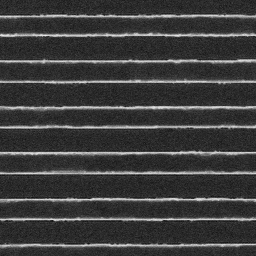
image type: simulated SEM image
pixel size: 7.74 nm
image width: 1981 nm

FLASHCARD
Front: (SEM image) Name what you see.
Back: lines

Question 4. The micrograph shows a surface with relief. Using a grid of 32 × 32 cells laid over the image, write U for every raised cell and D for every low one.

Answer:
DDDDDDDDDDDDDDDDDDDDDDDDDDDDDDDD
DDDDDDDDDDDDDDDDDDDDDDDDDDDDDDDD
UUUUUUUUUUUUUUUUUUUUUUUUUUUUUUUU
UUUUUUUUUUUUUUUUUUUUUUUUUUUUUUUU
DDDDDDDDDDDDDDDDDDDDDDDDDDDDDDDD
DDDDDDDDDDDDDDDDDDDDDDDDDDDDDDDD
DDDDDDDDDDDDDDDDDDDDDDDDDDDDDDDD
DDDDDDDDDDDDDDDDDDDDDDDDDDDDDDDD
UUUUUUUUUUUUUUUUUUUUUUUUUUUUUUUU
UUUUUUUUUUUUUUUUUUUUUUUUUUUUUUUU
DDDDDDDDDDDDDDDDDDDDDDDDDDDDDDDD
DDDDDDDDDDDDDDDDDDDDDDDDDDDDDDDD
DDDDDDDDDDDDDDDDDDDDDDDDDDDDDDDD
UUUUDUUUUUUUUUUUUUUUUUUUUUUUUUUU
UUUUUUUUUUUUUUUUUUUUUUUUUUUUUUUU
UUUUUUUUUUUUUUUUUUUUUUUUUUUUUUUU
DDDDDDDDDDDDDDDDDDDDDDDDDDDDDDDD
DDDDDDDDDDDDDDDDDDDDDDDDDDDDDDDD
DDDDDDDDDDDDDDDDDDDDDDDDDDDDDDDD
UUUUUUUUUUUUUUUUUUUUUUUUUUUUUUUU
UUUUUUUUUUUUUUUUUUUUUUUUUUUUUUUU
UUUUUUUUUUUUUUUUUUUUUUUUUUUUUUUU
DDDDDDDDDDDDDDDDDDDDDDDDDDDDDDDD
DDDDDDDDDDDDDDDDDDDDDDDDDDDDDDDD
DDDDDDDDDDDDDDDDDDDDDDDDDDDDDDDD
UUUUUUUUUUUUUUUUUUUUUUUUUUUUUUUU
UUUUUUUUUUUUUUUUUUUUUUUUUUUUUUUU
DDDDDDDDDDDDDDDDDDDDDDDDDDDDDDDD
DDDDDDDDDDDDDDDDDDDDDDDDDDDDDDDD
DDDDDDDDDDDDDDDDDDDDDDDDDDDDDDDD
DDDDDDDDDDDDDDDDDDDDDDDDDDDDDDDD
UUUUUUUUUUUUUUUUUUUUUUUUUUUUUUUU